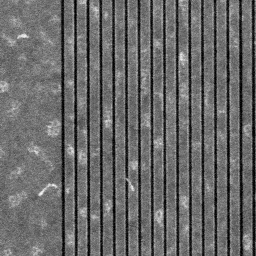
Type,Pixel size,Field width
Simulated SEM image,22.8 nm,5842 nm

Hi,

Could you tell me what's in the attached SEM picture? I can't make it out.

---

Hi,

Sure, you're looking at parallel lines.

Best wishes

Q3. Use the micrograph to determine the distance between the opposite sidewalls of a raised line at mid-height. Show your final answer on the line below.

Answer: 0.203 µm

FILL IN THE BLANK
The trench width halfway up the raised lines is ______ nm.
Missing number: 85.6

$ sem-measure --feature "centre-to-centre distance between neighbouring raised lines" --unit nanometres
290